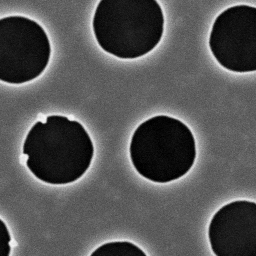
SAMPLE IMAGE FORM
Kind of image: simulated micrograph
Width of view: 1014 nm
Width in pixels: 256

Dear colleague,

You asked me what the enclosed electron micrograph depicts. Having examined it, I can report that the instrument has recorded holes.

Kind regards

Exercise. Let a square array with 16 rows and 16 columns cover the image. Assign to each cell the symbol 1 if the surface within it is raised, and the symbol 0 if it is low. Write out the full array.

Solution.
1111110000111100
0011110000111000
0001110000111000
0001111001111000
0001111111111111
1111111111111111
1111111111111111
1110111110011111
1100001100001111
1100001100001111
1100011100001111
1110111111111111
1111111111111111
1111111111111000
0111111111111000
0111110001111000